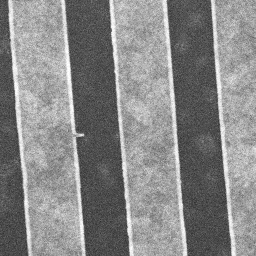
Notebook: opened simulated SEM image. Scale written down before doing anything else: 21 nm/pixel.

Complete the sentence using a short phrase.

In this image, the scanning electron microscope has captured one or a few lines or trenches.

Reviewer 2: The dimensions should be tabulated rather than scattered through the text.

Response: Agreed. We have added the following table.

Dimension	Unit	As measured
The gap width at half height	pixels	47.2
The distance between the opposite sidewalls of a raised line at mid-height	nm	1120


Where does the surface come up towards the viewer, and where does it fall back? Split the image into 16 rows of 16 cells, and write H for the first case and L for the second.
LHHHLLLHHHLLLHHH
LHHHLLLHHHLLLHHH
LHHHLLLHHHHLLHHH
LHHHLLLHHHHLLLHH
LHHHLLLHHHHLLLHH
LHHHLLLHHHHLLLHH
LHHHLLLHHHHLLLHH
LHHHHLLLHHHLLLHH
LHHHHLLLHHHLLLHH
LHHHHLLLHHHLLLHH
LHHHHLLLHHHLLLHH
LLHHHLLLHHHLLLHH
LLHHHLLLHHHLLLHH
LLHHHLLLHHHLLLHH
LLHHHLLLHHHLLLHH
LLHHHLLLHHHHLLLH